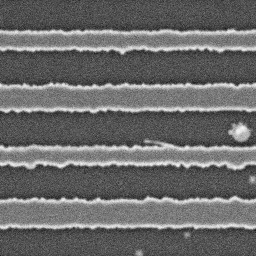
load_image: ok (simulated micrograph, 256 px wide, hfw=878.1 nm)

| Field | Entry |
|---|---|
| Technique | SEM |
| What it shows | lines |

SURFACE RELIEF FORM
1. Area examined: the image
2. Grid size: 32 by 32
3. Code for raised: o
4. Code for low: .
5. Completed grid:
................................
................................
................................
................................
oooooooooooooooooooooooooooooooo
oooooooooooooooooooooooooooooooo
................................
................................
................................
................................
......oo.......o.......o...oo...
oooooooooooooooooooooooooooooooo
oooooooooooooooooooooooooooooooo
oooooooooooooooooooooooooooooooo
................................
................................
.............................oo.
..............................o.
oooooooooooooooooooooooooooooooo
oooooooooooooooooooooooooooooooo
ooooo.oooooooo.oooooo.ooooooooo.
................................
................................
................................
................................
oooooooooooooooooooooooooooooooo
oooooooooooooooooooooooooooooooo
oooooooooooooooooooooooooooooooo
o.....o........................o
................................
................................
................................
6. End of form